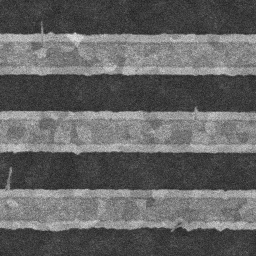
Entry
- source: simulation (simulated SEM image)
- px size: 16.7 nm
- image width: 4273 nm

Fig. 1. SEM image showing one or a few lines or trenches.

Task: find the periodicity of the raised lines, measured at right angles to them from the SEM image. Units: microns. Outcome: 1.29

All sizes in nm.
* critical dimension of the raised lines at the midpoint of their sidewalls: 551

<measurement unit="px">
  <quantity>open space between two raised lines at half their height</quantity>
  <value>43.9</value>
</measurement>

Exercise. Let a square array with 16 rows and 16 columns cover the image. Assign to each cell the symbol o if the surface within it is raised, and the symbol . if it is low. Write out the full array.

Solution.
................
................
oooooooooooooooo
oooooooooooooooo
................
................
................
oooooooooooooooo
oooooooooooooooo
................
................
................
oooooooooooooooo
oooooooooooooooo
................
................